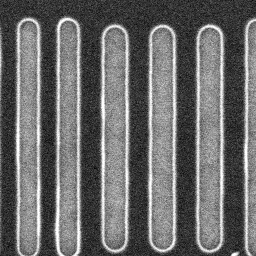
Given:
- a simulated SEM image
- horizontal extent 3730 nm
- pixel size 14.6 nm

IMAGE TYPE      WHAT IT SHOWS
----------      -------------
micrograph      groups of lines, slits or small figures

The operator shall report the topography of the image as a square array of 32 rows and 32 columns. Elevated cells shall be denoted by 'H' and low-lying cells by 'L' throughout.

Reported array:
HHHHHHHHHHHHHHHHHHHHHHHHHHHHHHHH
HHHHHHHHHHHHHHHHHHHHHHHHHHHHHHHH
HHHHHHHHLHHHHHHHHHHHHHHHHHHHHHHH
HHLLLHHLLLHHHHLHHHHHLHHHHHLHHHHL
HHLLLHHLLLHHHLLLHHHLLLHHHLLLHHHL
HHLLLHHLLLHHHLLLHHHLLLHHHLLLHHHL
HHLLLHHLLLHHHLLLHHHLLLHHHLLLHHHL
HHLLLHHLLLHHHLLLHHHLLLHHHLLLHHHL
HHLLLHHLLLHHHLLLHHHLLLHHHLLLHHHL
HHLLLHHLLLHHHLLLHHHLLLHHHLLLHHHL
HHLLLHHLLLHHHLLLHHHLLLHHHLLLHHHL
HHLLLHHLLLHHHLLLHHHLLLHHHLLLHHHL
HHLLLHHLLLHHHLLLHHHLLLHHHLLLHHHL
HHLLLHHLLLHHHLLLHHHLLLHHHLLLHHHL
HHLLLHHLLLHHHLLLHHHLLLHHHLLLHHHL
HHLLLHHLLLHHHLLLHHHLLLHHHLLLHHHL
HHLLLHHLLLHHHLLLHHHLLLHHHLLLHHHL
HHLLLHHLLLHHHLLLHHHLLLHHHLLLHHHL
HHLLLHHLLLHHHLLLHHHLLLHHHLLLHHHL
HHLLLHHLLLHHHLLLHHHLLLHHHLLLHHHL
HHLLLHHLLLHHHLLLHHHLLLHHHLLLHHHL
HHLLLHHLLLHHHLLLHHHLLLHHHLLLHHHL
HHLLLHHLLLHHHLLLHHHLLLHHHLLLHHHL
HHLLLHHLLLHHHLLLHHHLLLHHHLLLHHHL
HHLLLHHLLLHHHLLLHHHLLLHHHLLLHHHL
HHLLLHHLLLHHHLLLHHHLLLHHHLLLHHHL
HHLLLHHLLLHHHLLLHHHLLLHHHLLLHHHL
HHLLLHHLLLHHHLLLHHHLLLHHHLLLHHHL
HHLLLHHLLLHHHLLLHHHLLLHHHLLLHHHL
HHLLLHHLLLHHHLLLHHHLLLHHHLLLHHHL
HHLLLHHLLLHHHLLLHHHLLLHHHLLHHHHL
HHHLHHHLLLHHHHHHHHHHHHHHHHHHHHHL